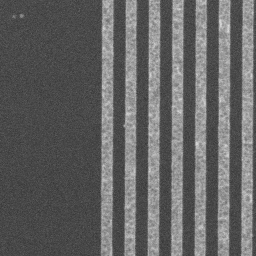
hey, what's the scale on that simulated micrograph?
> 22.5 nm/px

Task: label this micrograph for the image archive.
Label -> parallel lines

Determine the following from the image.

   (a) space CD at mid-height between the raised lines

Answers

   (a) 304 nm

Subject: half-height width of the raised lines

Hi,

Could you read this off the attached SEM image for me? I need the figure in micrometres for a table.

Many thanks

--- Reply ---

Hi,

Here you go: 0.217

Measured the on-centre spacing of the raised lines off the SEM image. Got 526 nanometres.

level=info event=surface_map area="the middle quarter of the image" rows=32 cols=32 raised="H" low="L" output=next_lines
LLLLLLLLLLHHLLLLHHLLLHHHLLLHHHLL
LLLLLLLLLLHHLLLLHHLLLHHHLLLHHHLL
LLLLLLLLLLHHLLLLLHLLLHHHLLLHHHLL
LLLLLLLLLLHHLLLLLHLLLHHHLLLHHHLL
LLLLLLLLLLHHLLLLHHLLLHHHLLLHHLLL
LLLLLLLLLLHHLLLLHHLLLHHHLLLHHLLL
LLLLLLLLLLHHLLLLHHLLLHHHLLLHHLLL
LLLLLLLLLLHHLLLLHHLLLHHHLLLHHLLL
LLLLLLLLLLHHLLLLHHLLLHHHLLLHHLLL
LLLLLLLLLLHHLLLLHHLLLHHHLLLHHLLL
LLLLLLLLLLHHLLLLHHLLLHHHLLLHHLLL
LLLLLLLLLLHHLLLLHHLLLHHHLLLHHLLL
LLLLLLLLLLHHLLLLHHLLLHHHLLLHHLLL
LLLLLLLLLLHHLLLLHHLLLHHHLLLHHLLL
LLLLLLLLLLHHLLLHHHLLLHLHLLLHHLLL
LLLLLLLLLLHHLLLHHHLLLHHHLLLHHLLL
LLLLLLLLLLHHLLLLHHLLLHHHLLLHHHLL
LLLLLLLLLLHHLLLLHHLLLHHHLLLLHLLL
LLLLLLLLLLHHLLLHHHLLLHHHLLLHHLLL
LLLLLLLLLLHHLLLLHHLLLHHHLLLHHLLL
LLLLLLLLLLHHLLLLHHLLLHHHLLLHHLLL
LLLLLLLLLLHHLLLLHHLLLHHHLLLHHLLL
LLLLLLLLLLHHLLLLHHLLLHHHLLLHHLLL
LLLLLLLLLLHHLLLLHHLLLHHHLLLHHLLL
LLLLLLLLLLHHLLLLHHLLLHHLLLLHHLLL
LLLLLLLLLLHHLLLLHHLLLHHLLLLHHLLL
LLLLLLLLLLLHLLLLHHLLLHHLLLLHHLLL
LLLLLLLLLLHHLLLLHHLLLHHLLLLHHLLL
LLLLLLLLLLHHLLLHHHLLLHHHLLLHHLLL
LLLLLLLLLLHHLLLHHHLLLHHHLLLHHLLL
LLLLLLLLLLHHLLLLHHLLLHHHLLLHHLLL
LLLLLLLLLLHHLLLLHHLLLHHHLLLHHLLL